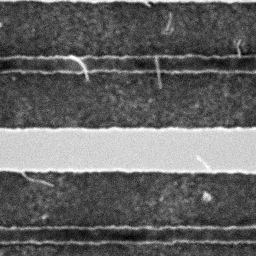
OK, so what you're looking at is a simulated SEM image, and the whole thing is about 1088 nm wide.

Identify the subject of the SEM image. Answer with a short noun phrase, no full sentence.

lines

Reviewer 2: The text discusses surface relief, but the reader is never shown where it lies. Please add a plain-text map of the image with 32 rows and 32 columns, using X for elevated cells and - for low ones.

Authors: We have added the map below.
--------------------------------
--------------------------------
--------------------------------
--------------------------------
--------------------------------
--------------------------------
--------------------------------
XXXXXXXXXXXXXXXXXXXXXXXXXXXXXXXX
XXXXXXXXXXXXXXXXXXXXXXXXXXXXXXXX
--------------------------------
--------------------------------
--------------------------------
--------------------------------
--------------------------------
--------------------------------
--------------------------------
XXXXXXXXXXXXXXXXXXXXXXXXXXXXXXXX
XXXXXXXXXXXXXXXXXXXXXXXXXXXXXXXX
XXXXXXXXXXXXXXXXXXXXXXXXXXXXXXXX
XXXXXXXXXXXXXXXXXXXXXXXXXXXXXXXX
XXXXXXXXXXXXXXXXXXXXXXXXXXXXXXXX
--X-------------------XXXXX-XXXX
--------------------------------
--------------------------------
--------------------------------
--------------------------------
--------------------------------
--------------------------------
----XXXXXX--XXXXXXX-XXXXXXXXXXXX
XXXXXXXXXXXXXXXXXXXXXXXXXXXXXXXX
--------------------------------
--------------------------------